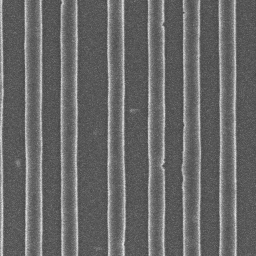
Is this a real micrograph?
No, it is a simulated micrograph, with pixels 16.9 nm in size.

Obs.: parallel lines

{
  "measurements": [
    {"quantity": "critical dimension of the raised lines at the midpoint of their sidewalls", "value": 263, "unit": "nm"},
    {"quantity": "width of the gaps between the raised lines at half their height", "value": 381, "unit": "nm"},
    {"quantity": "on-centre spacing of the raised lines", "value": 654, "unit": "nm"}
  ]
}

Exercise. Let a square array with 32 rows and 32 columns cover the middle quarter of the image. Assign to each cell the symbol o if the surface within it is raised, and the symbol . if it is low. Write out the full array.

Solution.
ooo........oooo......oooo.....oo
ooo........oooo......oooo.....oo
ooo........oooo......oooo.....oo
ooo........oooo......oooo.....oo
ooo........oooo......oooo.....oo
ooo........oooo......oooo.....oo
ooo........oooo......oooo.....oo
ooo........oooo......oooo.....oo
ooo........oooo......oooo.....oo
ooo........oooo......oooo.....oo
ooo........oooo......oooo.....oo
ooo........oooo......oooo.....oo
ooo........oooo......oooo.....oo
ooo........oooo......oooo.....oo
ooo........oooo......oooo.....oo
ooo........oooo......oooo.....oo
ooo........oooo......oooo.....oo
ooo........oooo......oooo.....oo
ooo........oooo......oooo.....oo
ooo........oooo......oooo.....oo
ooo........oooo......oooo.....oo
ooo........oooo......oooo.....oo
ooo........oooo......oooo.....oo
ooo........oooo......oooo.....oo
ooo........oooo......oooo.....oo
ooo........oooo......oooo.....oo
ooo........oooo......oooo.....oo
ooo........oooo......oooo.....oo
ooo........oooo......oooo.....oo
ooo........oooo......oooo.....oo
ooo........oooo......oooo.....oo
ooo........oooo......oooo.....oo